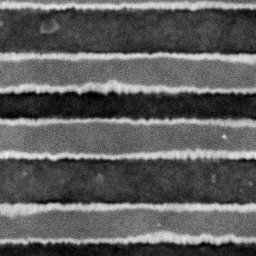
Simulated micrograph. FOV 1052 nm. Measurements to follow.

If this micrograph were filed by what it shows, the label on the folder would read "lines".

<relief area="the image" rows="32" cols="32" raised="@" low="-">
@@@@@@@@@@@@@@@@@@@@@@@@@@@@@@@@
--------------------------------
--------------------------------
--------------------------------
--------------------------------
--------------------------------
--------------------------------
@@@@@@@@@@@@@@@@@@@@@@@@@@@@@@@@
@@@@@@@@@@@@@@@@@@@@@@@@@@@@@@@@
@@@@@@@@@@@@@@@@@@@@@@@@@@@@@@@@
@@@@@@@@@@@@@@@@@@@@@@@@@@@@@@@@
@-----------------@--@--@@@@@@@@
--------------------------------
--------------------------------
--------------------------------
@@@@@@@@@@@@@@@@@@@@@@@@@@@@@@@@
@@@@@@@@@@@@@@@@@@@@@@@@@@@@@@@@
@@@@@@@@@@@@@@@@@@@@@@@@@@@@@@@@
@@@@@@@@@@@@@@@@@@@@@@@@@@@@@@@@
@@@@@@@@@@@@@@@@@@@@@@@@@@@@@@@@
--------------------------------
--------------------------------
--------------------------------
--------------------------------
--------------------------------
--------------------------------
@@@@@@@@@@@@@@@@@@@@@@@@@@@@@@@@
@@@@@@@@@@@@@@@@@@@@@@@@@@@@@@@@
@@@@@@@@@@@@@@@@@@@@@@@@@@@@@@@@
@@@@@@@@@@@@@@@@@@@@@@@@@@@@@@@@
--------------------------------
--------------------------------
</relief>